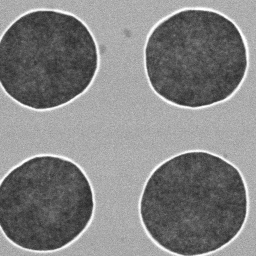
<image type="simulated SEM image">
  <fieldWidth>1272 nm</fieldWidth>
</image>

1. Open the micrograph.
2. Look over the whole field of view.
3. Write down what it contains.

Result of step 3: holes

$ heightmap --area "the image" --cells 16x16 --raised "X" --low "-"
XXXXXXXXXXXXXXXX
X----XXXXX-----X
------XXX------X
------XXX------X
------XXX------X
-----XXXXX-----X
X---XXXXXXX--XXX
XXXXXXXXXXXXXXXX
XXXXXXXXXXXXXXXX
XXXXXXXXXXXXXXXX
X----XXXXX-----X
------XXX------X
------XXX------X
------XXX------X
-----XXXX------X
X---XXXXXX----XX